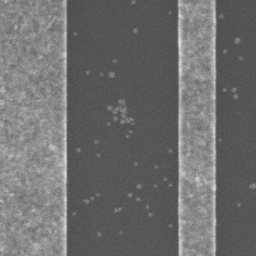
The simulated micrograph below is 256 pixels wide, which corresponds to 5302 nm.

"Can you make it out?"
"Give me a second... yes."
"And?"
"wiring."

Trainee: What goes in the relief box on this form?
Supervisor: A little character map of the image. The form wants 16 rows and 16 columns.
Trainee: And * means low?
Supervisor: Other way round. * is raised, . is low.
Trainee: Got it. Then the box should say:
****.......**...
****.......**...
****.......**...
****.......**...
****.......**...
****.......**...
****.......**...
****.......**...
****.......**...
****.......**...
****.......**...
****.......**...
****.......**...
****.......**...
****.......**...
****.......**...